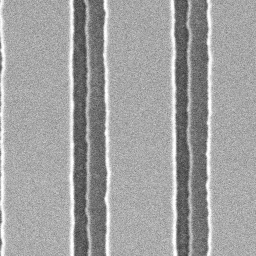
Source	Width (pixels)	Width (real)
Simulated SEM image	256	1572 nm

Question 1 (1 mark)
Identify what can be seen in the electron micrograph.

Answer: lines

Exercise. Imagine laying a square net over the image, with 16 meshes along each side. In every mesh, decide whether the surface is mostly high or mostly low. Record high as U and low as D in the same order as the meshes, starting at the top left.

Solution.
UUUUUDDUUUUDDUUU
UUUUUDDUUUUDDUUU
UUUUDDDUUUUDDUUU
UUUUDDUUUUUDDUUU
UUUUDDDUUUUDDUUU
UUUUUDDUUUUDDUUU
UUUUUDDUUUUDDUUU
UUUUDDDUUUUDDUUU
UUUUUDDUUUUDDUUU
UUUUUDDUUUUDDUUU
UUUUUDDUUUUDDUUU
UUUUUDDUUUUDDUUU
UUUUUDDUUUUDDUUU
UUUUUDDUUUUDDUUU
UUUUUDDUUUUDDUUU
UUUUUDDUUUUDDUUU